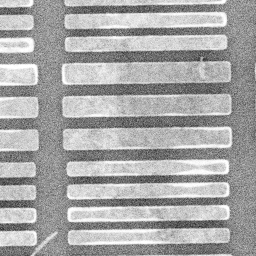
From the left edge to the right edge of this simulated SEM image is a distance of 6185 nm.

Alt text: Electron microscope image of groups of lines, slits or small figures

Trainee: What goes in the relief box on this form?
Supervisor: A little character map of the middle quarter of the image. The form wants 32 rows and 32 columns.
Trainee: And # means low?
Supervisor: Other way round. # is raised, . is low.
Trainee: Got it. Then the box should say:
################################
################################
################################
################################
##########################......
................................
................................
................................
################################
################################
################################
################################
###########################..###
................................
................................
................................
################################
################################
################################
################################
################################
................................
................................
................................
.....######.......##############
.###############################
.###############################
.###########################....
................................
................................
.###############################
.###############################